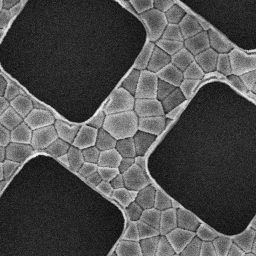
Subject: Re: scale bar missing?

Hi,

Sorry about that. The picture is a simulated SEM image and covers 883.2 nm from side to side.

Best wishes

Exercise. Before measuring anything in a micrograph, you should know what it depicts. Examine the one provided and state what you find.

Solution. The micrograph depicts holes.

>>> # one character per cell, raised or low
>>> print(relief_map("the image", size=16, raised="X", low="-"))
X-------XXXX----
X--------XXXX---
---------XXXXX--
---------XXXXXXX
--------XXXXXXXX
XX-----XXXXXX-XX
XXX---XXXXXX----
XXXX-XXXXXX-----
XXXXXXXXXX------
XXXXXXXXXX------
X---XXXXX-------
X----XXXXX------
-------XXXX-----
--------XXXX----
--------XXXXXX-X
-------XXXXXXXXX